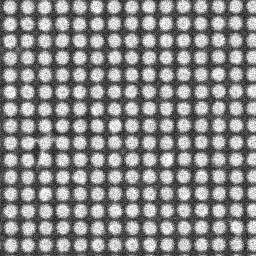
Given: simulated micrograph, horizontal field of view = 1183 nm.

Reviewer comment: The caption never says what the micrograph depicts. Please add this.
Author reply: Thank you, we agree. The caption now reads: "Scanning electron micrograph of a regular array of raised bodies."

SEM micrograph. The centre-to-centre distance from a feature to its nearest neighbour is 0.0778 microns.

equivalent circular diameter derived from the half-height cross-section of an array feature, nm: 56.2